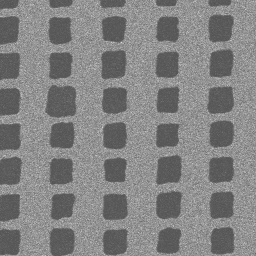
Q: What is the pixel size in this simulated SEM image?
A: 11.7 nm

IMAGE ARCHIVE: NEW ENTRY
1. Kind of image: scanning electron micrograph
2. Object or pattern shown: a regular array of holes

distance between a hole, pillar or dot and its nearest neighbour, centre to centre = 410 nm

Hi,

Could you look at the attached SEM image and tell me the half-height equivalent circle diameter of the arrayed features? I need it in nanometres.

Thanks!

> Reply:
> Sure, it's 316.